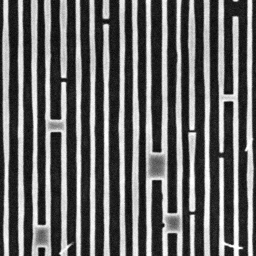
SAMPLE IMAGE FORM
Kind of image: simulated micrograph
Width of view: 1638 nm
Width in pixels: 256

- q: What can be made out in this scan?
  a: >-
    parallel lines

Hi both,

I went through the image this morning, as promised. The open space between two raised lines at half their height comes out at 64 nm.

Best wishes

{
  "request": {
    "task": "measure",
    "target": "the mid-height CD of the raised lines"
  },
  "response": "0.0288 µm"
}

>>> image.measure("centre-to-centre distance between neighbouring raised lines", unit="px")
14.3